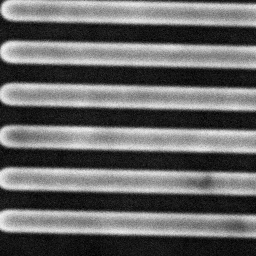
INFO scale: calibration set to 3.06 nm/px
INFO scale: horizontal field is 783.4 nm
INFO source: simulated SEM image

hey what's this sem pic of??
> groups of lines, slits or small figures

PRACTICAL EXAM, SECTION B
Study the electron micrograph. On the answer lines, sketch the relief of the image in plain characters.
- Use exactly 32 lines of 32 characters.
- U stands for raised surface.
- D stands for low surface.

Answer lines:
UUUUUUUUUUUUUUUUUUUUUUUUUUDDDDDD
UUUUUUUUUUUUUUUUUUUUUUUUUUUUUUUU
DDUUUUUUUUUUUUUUUUUUUUUUUUUUUUUU
DDDDDDDDDDDDDDDDDDDDDDDDDDDDDDDD
DDDDDDDDDDDDDDDDDDDDDDDDDDDDDDDD
DUUUUUUUUUUDDDDDDDDDDDDDDDDDDDDD
UUUUUUUUUUUUUUUUUUUUUUUUUUUUUUUU
DUUUUUUUUUUUUUUUUUUUUUUUUUUUUUUU
DDDDDDDDDDDDDDDDDDDDDDDDDDDDDDDD
DDDDDDDDDDDDDDDDDDDDDDDDDDDDDDDD
DDDDDDDDDDDDDDDDDDDDDDDDDDDDDDDD
UUUUUUUUUUUUUUUUUUUUUUUUUUUUUUUU
UUUUUUUUUUUUUUUUUUUUUUUUUUUUUUUU
DDDDDDDDDDDDDDDDDDDDDDDUUUUUUUUU
DDDDDDDDDDDDDDDDDDDDDDDDDDDDDDDD
DDDDDDDDDDDDDDDDDDDDDDDDDDDDDDDD
UUUUUUUUUUUUUUUUUUUUUUUUUUUUUUUU
UUUUUUUUUUUUUUUUUUUUUUUUUUUUUUUU
DDDDDDDDDUUUUUUUUUUUUUUUUUUUUUUU
DDDDDDDDDDDDDDDDDDDDDDDDDDDDDDDD
DDDDDDDDDDDDDDDDDDDDDDDDDDDDDDDD
UUUUUUUUUUUUUUUUUUUDDDDDDDDDDDDD
UUUUUUUUUUUUUUUUUUUUUUUUUUUUUUUU
DUUUUUUUUUUUUUUUUUUUUUUUUUUUUUUU
DDDDDDDDDDDDDDDDDDDDDDDDDDDDDDDD
DDDDDDDDDDDDDDDDDDDDDDDDDDDDDDDD
UUUUUUUUUDDDDDDDDDDDDDDDDDDDDDDD
UUUUUUUUUUUUUUUUUUUUUUUUUUUUUUUU
UUUUUUUUUUUUUUUUUUUUUUUUUUUUUUUU
DDDDDDDDDDDDDDDDDDDDDDDDDDDDDDDU
DDDDDDDDDDDDDDDDDDDDDDDDDDDDDDDD
DDDDDDDDDDDDDDDDDDDDDDDDDDDDDDDD